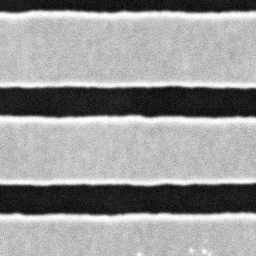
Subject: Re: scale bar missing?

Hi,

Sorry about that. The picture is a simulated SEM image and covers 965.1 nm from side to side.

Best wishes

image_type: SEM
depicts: lines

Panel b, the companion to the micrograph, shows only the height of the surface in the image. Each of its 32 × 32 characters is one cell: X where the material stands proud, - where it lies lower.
--------------------------------
---XXXXXXX-----X---XXX---------X
XXXXXXXXXXXXXXXXXXXXXXXXXXXXXXXX
XXXXXXXXXXXXXXXXXXXXXXXXXXXXXXXX
XXXXXXXXXXXXXXXXXXXXXXXXXXXXXXXX
XXXXXXXXXXXXXXXXXXXXXXXXXXXXXXXX
XXXXXXXXXXXXXXXXXXXXXXXXXXXXXXXX
XXXXXXXXXXXXXXXXXXXXXXXXXXXXXXXX
XXXXXXXXXXXXXXXXXXXXXXXXXXXXXXXX
XXXXXXXXXXXXXXXXXXXXXXXXXXXXXXXX
XXXXXXXXXXXXXXXXXXXXXXXXXXXXXXXX
--------------------------------
--------------------------------
--------------------------------
XX----------X--XXX--------------
XXXXXXXXXXXXXXXXXXXXXXXXXXXXXXXX
XXXXXXXXXXXXXXXXXXXXXXXXXXXXXXXX
XXXXXXXXXXXXXXXXXXXXXXXXXXXXXXXX
XXXXXXXXXXXXXXXXXXXXXXXXXXXXXXXX
XXXXXXXXXXXXXXXXXXXXXXXXXXXXXXXX
XXXXXXXXXXXXXXXXXXXXXXXXXXXXXXXX
XXXXXXXXXXXXXXXXXXXXXXXXXXXXXXXX
XXXXXXXXXXXXXXXXXXXXXXXXXXXXXXXX
--------------------------------
--------------------------------
--------------------------------
--------------------------------
XXXXXXXXXXXXXXXXXXXXXXXXXXXXXXXX
XXXXXXXXXXXXXXXXXXXXXXXXXXXXXXXX
XXXXXXXXXXXXXXXXXXXXXXXXXXXXXXXX
XXXXXXXXXXXXXXXXXXXXXXXXXXXXXXXX
XXXXXXXXXXXXXXXXXXXXXXXXXXXXXXXX